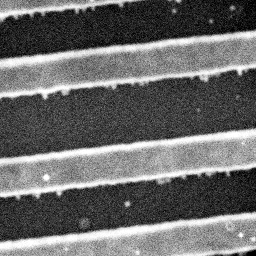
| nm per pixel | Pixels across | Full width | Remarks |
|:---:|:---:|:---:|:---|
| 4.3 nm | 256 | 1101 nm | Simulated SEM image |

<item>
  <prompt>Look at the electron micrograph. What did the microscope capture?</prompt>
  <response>lines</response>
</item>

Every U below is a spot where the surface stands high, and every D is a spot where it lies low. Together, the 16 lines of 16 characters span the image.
UUUUUDDDDDDDDDDD
DDDDDDDDDDDDDDDD
DDDDDDDDDDDUUUUU
DDDUUUUUUUUUUUUU
UUUUUUUUUUUUUUDD
UUUUUDDDDDDDDDDD
DDDDDDDDDDDDDDDD
DDDDDDDDDDDDDDDD
DDDDDDDDDDDDDUUU
DDDDUUUUUUUUUUUU
UUUUUUUUUUUUUUUU
UUUUUUUDDDDDDDDD
DDDDDDDDDDDDDDDD
DDDDDDDDDDDDDDUU
DDDDDDUUUUUUUUUU
UUUUUUUUUUUUUUUU